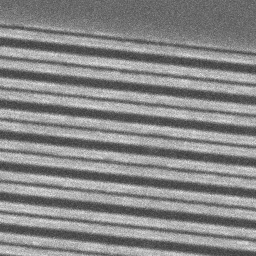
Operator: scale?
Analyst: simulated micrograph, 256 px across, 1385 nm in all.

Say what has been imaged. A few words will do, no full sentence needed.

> parallel lines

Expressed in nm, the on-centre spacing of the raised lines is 83.9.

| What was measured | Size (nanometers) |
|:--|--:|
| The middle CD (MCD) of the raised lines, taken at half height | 45.7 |